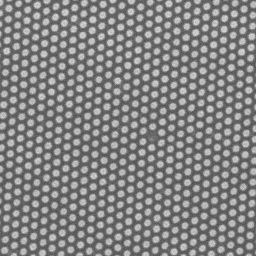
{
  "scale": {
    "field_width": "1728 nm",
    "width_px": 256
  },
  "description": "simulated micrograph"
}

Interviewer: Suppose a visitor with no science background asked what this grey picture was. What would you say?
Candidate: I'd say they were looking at a regular array of raised bodies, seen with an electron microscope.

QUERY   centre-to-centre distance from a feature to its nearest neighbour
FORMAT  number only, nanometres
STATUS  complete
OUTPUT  71.1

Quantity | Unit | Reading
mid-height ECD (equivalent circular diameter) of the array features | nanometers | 41.7